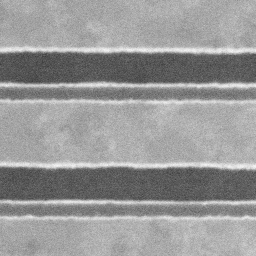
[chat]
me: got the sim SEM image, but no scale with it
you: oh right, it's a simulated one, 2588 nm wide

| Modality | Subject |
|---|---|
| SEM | lines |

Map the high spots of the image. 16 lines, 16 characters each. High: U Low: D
UUUUUUUUUUUUUUUU
UUUUUUUUUUUUUUUU
UUUUUUUUUUUUUUUU
DDDDDDDDDDDDDDDD
DDDDDDDDDDDDDDDD
DDDDDDDDDDDDDDDD
UUUUUUUUUUUUUUUU
UUUUUUUUUUUUUUUU
UUUUUUUUUUUUUUUU
UUUUUUUUUUUUUUUU
DDDDDDDDDDDDDDDD
DDDDDDDDDDDDDDDD
DDDDDDDDDDDDDDDD
DUDDDDDDDDDDDDDD
UUUUUUUUUUUUUUUU
UUUUUUUUUUUUUUUU